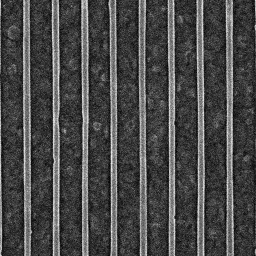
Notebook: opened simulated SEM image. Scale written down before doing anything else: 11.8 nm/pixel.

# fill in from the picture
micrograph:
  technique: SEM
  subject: parallel lines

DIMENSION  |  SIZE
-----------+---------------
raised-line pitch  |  342 nanometers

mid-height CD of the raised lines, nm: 66.5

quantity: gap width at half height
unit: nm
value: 275